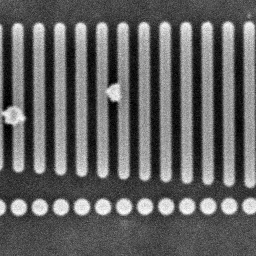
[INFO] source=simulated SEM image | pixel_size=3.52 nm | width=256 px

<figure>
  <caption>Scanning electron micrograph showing groups of lines, slits or small figures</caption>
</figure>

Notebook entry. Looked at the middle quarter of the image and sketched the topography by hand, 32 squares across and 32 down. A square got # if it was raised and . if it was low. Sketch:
...##...###...##...##...##...###
...##...###...##...##...##...###
...##...###...##...##...##...###
...##...###...##...##...##...###
...##...###...##...##...##...###
...##...###.####...##...##...###
...##...########...##...##...###
...##...########...##...##...###
...##...###.####...##...##...###
...##...###..###...##...##...###
...##...###...##...##...##...###
...##...###...##...##...##...###
...##...###...##...##...##...###
...##...###...##...##...##...###
...##...###...##...##...###..###
...##...###...##...##...###..###
...##...###...##...##...###...##
...##...###...##...##...###...##
...##...###...##...##...###...##
...##...###...##...##...###...##
...##...###...##...##...###...##
...##...###...##...##...###...##
...##...###...##...##...###...##
...###..###...##...##...###...##
...###..###...##...##...###...##
...###...##...##...##...###...##
...###...##...##...##...###...##
....#....##...##...##...###...##
..............##...##...###...##
..............................#.
................................
................................